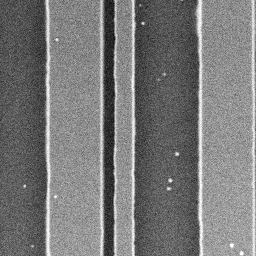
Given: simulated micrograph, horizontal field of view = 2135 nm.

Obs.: lines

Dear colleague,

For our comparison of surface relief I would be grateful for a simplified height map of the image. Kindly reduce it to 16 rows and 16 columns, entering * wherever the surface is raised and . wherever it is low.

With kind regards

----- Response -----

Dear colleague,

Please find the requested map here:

...*****.....***
...*****.....***
...*****.....***
...*****.....***
...*****.....***
...*****.....***
...*****.....***
...*****.....***
...*****.....***
...*****.....***
...*****.....***
...*****.....***
...*****.....***
...*****.....***
...*****.....***
...*****.....***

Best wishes